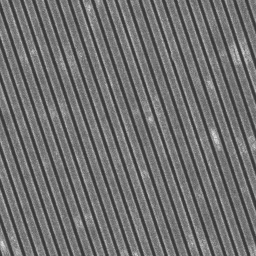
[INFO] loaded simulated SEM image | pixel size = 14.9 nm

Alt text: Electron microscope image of parallel lines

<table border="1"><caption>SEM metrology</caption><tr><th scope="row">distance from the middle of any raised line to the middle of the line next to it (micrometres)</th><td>0.167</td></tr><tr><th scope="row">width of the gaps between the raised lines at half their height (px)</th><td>3.55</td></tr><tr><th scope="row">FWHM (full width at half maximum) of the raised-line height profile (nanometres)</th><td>118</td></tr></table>